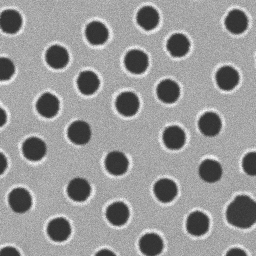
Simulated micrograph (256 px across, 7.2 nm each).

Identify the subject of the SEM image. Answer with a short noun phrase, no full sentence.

a regular array of holes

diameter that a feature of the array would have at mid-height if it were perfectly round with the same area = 174 nanometers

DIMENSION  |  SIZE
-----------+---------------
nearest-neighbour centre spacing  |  320 nm